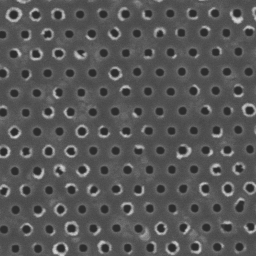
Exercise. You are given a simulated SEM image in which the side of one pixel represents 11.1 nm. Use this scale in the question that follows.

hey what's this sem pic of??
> a regular array of holes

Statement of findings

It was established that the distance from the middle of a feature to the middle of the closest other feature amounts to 241 nanometres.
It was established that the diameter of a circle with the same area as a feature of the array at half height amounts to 95.2 nm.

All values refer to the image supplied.